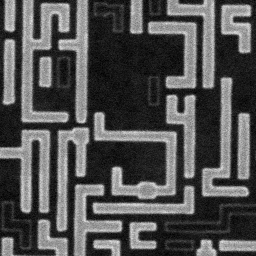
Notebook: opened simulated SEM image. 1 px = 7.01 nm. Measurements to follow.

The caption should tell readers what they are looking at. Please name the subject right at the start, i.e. wiring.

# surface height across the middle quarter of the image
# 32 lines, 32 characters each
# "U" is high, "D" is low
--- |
UDDUUDDDDDDDDDDDDDDDDDDDDDDDDDUU
UDDUUDDDDDDDDDDDDDDDDDDDDDDDDDUU
UDDUUDDDDDDDDDDDDDDDDDDDDDDDDDUU
UDDUUDDDDDDDDDDDDDDDDDUDDDUUUUUU
UDDUUDDDDDDDDDDDDDDDDUUUDDUUUUUU
UDDUUDDDDDDDDDDDDDDDDUUUDDUUUUUU
DDDUUDDDDDDDDDDDDDDDDUUUDDDDDDDD
DDDUUDDDDDDDDDDDDDDDDUUUDDDDDDDD
DDDUUDDDDDDDDDDDDDDDDUUUDDUUDDUU
DDDUUDDDDDDDDDDDDDDDDUUUDDUUDDUU
DDDUUDDDDDDDDDDDDDDDDDDDDDUUDDUU
DDDUUDDDDDDDDDDDDDDDDDDDDDUUDDUU
UDDUUDDDUUDDDDDDDDDDDDDDDDUUUDUU
UDDUUDDDUUDDDDDDDDDDDDDDDDUUUUUU
DDDDUDDDUUDDDDDDDDDDDDDDDDUUUUUU
DDDDDDDDUUDDDDDDDDDDDDDDDDDDDDUU
DDUUUUDDUUDDDDDDDDDDDDDDDDDDDDUU
UUUUUUDDUUUUUUUUUUUUUUUUUUUUDDUU
UUUUUUDDUUUUUUUUUUUUUUUUUUUUDDUU
UDDUUUDDDDDDDDDDDDDDDDDDDDUUDDUU
UDDUUDDDDDDDDDDDDDDDDDDDDDUUDDUU
UDDUUDDDDDDDDDDDDDDDDDDDDDUUDDUU
UDDUUDDDDDDDDDDDDDDDDDDDDDUUDDUU
UDDUUDDDDDDDDDDDDDDDDDDDDDUUDDUU
UDDUUDDDDDDDDDDDDDDDDDDDDDUUDDUU
UDDUUDDDDDDDDDDDDDDDDDDDDDUUDDUU
UDDUUDDDDDDDUUDDDDDDDDDDDDUUDDUU
UDDUUDDDDDDDUUDDDDDDDDDDDDUUDDUU
UDDDDDDDDDDDUUDDDDDDDDDDDDUUDDDD
UDDDDDDDDDDDUUDDDDDDDDDDDDUUDDDD
DDDUUUUUUDDDUUUDDDUUUUUDDUUUDDDD
DDDUUUUUUUDDUUUUUUUUUUUUUUUUDDUU